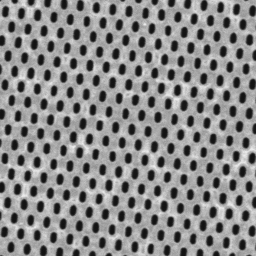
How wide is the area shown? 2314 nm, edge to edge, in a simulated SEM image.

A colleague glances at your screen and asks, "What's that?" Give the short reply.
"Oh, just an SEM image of a regular array of holes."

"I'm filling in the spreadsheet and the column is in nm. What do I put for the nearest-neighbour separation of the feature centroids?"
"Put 147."